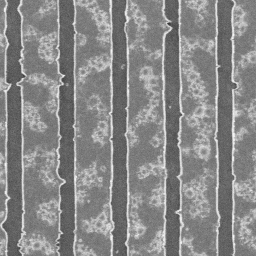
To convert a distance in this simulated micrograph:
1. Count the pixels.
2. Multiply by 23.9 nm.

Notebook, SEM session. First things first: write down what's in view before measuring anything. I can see parallel lines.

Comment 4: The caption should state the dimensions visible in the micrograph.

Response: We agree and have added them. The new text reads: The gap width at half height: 379 nm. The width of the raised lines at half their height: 891 nm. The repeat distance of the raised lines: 1260 nm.